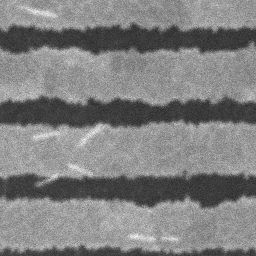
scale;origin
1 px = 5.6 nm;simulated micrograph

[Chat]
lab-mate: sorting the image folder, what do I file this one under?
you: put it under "one or a few lines or trenches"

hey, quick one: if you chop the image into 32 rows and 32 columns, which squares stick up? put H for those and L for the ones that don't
HHHHHHHHHHHHHHHHHHHHHHHHHHHHHHHH
HHHHHHHHHHHHHHHHHHHHHHHHHHHHHHHH
HHHHHHHHHHHHHHHHHHHHHHHHHHHHHHHH
HLLLLHHHLLLLLLLLLLHLHLLHLLHLHLLL
LLLLLLLLLLLLLLLLLLLLLLLLLLLLLLLL
LLLLLLLLLLLLLLLLLLLLLLLLLLLLLLLL
HLLLHHHHHHHLLLLLHLLLHLHHHLLLHHHH
HHHHHHHHHHHHHHHHHHHHHHHHHHHHHHHH
HHHHHHHHHHHHHHHHHHHHHHHHHHHHHHHH
HHHHHHHHHHHHHHHHHHHHHHHHHHHHHHHH
HHHHHHHHHHHHHHHHHHHHHHHHHHHHHHHH
HHHHHHHHHHHHHHHHHHHHHHHHHHHHHHHH
HLLLLLLLHHHLHHLLLLHHHLLLLLHLLLHH
LLLLLLLLLLLLLLLLLLLLLLLLLLLLLLLL
LLLLLLLLLLLLLLLLLLLLLLLLLLLLLLLL
LLLLLLLLLLLLLLLLLLLLHHHLLLHHHLHL
HHHHHHHHHHHHHHHHHHHHHHHHHHHHHHHH
HHHHHHHHHHHHHHHHHHHHHHHHHHHHHHHH
HHHHHHHHHHHHHHHHHHHHHHHHHHHHHHHH
HHHHHHHHHHHHHHHHHHHHHHHHHHHHHHHH
HHHHHHHHHHHHHHHHHHHHHHHHHHHHHHHH
HHHHHHHHHHHHHHHHHHHHHHHHHHHHHHHH
LLLLLLLLLLLLLLLLLLLLLLLLLLLLLLLL
LLLLLLLLLLLLLLLLLLLLLLLLLLLLLLLL
LLLLLLLLLLLLLLLLLLLLLLLLLLLLLLLL
HHHHHHHHHHHHHHHHHLLLHHHHLLLLHHHH
HHHHHHHHHHHHHHHHHHHHHHHHHHHHHHHH
HHHHHHHHHHHHHHHHHHHHHHHHHHHHHHHH
HHHHHHHHHHHHHHHHHHHHHHHHHHHHHHHH
HHHHHHHHHHHHHHHHHHHHHHHHHHHHHHHH
HHHHHHHHHHHHHHHHHHHHHHHHHHHHHHHH
LLLLLLLLLLLLLLLLLLLLLLLLLLLLLLLL